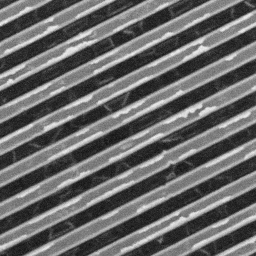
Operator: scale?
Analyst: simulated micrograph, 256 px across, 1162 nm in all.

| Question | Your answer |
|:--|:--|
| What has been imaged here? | parallel lines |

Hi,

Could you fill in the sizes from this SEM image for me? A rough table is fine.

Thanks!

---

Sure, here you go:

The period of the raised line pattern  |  131 nanometres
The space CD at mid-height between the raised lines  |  71.9 nm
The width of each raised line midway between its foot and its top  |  58.7 nm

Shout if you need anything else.